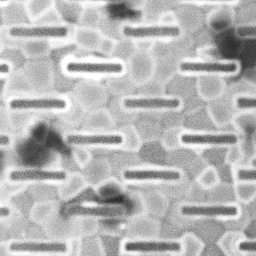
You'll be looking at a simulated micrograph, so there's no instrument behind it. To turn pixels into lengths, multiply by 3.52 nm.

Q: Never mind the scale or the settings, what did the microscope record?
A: a regular array of holes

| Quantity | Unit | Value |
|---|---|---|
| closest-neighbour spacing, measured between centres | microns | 0.236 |